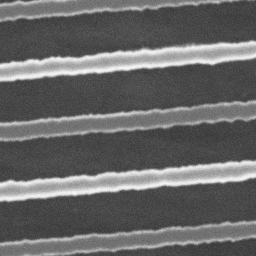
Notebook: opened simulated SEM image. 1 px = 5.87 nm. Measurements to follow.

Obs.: lines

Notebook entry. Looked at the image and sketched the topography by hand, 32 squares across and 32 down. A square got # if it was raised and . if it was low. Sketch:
#######################.#.......
############....................
#...............................
................................
................................
..............................##
.................###############
......#######################...
#################...............
######..........................
................................
................................
................................
........................########
...........#####################
.#######################........
###########.....................
##..............................
................................
................................
............................####
................################
....##########################..
###################.............
#######.........................
................................
................................
................................
.....................###########
...........#####################
#######################.........
###########.....................